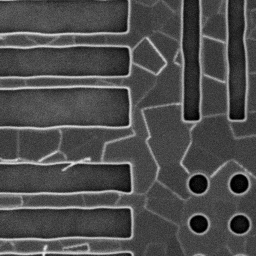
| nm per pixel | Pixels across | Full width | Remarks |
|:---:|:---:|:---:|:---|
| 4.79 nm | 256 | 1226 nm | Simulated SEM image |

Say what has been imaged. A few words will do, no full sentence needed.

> groups of lines, slits or small figures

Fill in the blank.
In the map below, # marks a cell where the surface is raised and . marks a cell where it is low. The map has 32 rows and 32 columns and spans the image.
................#######..###...#
................#######..###...#
................#######..###...#
................#######..###...#
#######################..###...#
#######################..###...#
................#######..###...#
................#######..###...#
................#######..###...#
...............########..###...#
#######################..###...#
................#######..###...#
................#######..####..#
................#######..####..#
................#######..####..#
................################
################################
################################
################################
################################
.....##.........################
................################
.................#######..###..#
.................#######..###..#
################################
################################
................################
.................#######..###..#
.................#######..###..#
................################
################################
################################